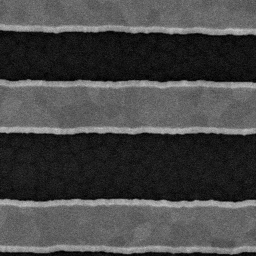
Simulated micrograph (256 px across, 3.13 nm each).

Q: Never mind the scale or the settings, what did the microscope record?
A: lines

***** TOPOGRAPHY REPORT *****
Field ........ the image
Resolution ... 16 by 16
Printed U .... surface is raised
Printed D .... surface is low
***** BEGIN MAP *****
UUUUUUUUUUUUUUUU
UUUUUUUUUUUUUUUU
DDDDDDDDDDDDDDDD
DDDDDDDDDDDDDDDD
DDDDDDDDDDDDDDDD
UUUUUUUUUUUUUUUU
UUUUUUUUUUUUUUUU
UUUUUUUUUUUUUUUU
DDDDDDDDDDDDDDDD
DDDDDDDDDDDDDDDD
DDDDDDDDDDDDDDDD
DDDDDDDDDDDDDDDD
DDDDDDDDDDDDDDDD
UUUUUUUUUUUUUUUU
UUUUUUUUUUUUUUUU
UUUUUUUUUUUUUUUU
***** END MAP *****